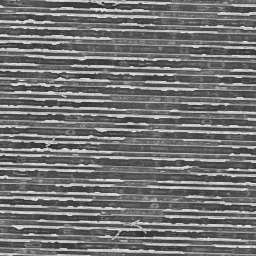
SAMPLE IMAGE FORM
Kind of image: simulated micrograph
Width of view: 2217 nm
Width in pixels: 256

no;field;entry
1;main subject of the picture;parallel lines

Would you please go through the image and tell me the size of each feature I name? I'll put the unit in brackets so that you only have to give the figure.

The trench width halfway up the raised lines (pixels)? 6.25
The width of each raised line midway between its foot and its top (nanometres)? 68.2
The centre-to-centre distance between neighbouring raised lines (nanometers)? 123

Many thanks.